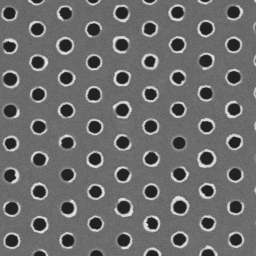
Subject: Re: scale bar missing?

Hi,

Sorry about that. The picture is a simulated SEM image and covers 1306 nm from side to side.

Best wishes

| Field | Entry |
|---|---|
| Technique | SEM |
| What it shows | a regular array of holes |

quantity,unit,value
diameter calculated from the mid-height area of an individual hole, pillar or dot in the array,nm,61.2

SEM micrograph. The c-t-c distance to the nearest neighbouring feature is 0.163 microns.